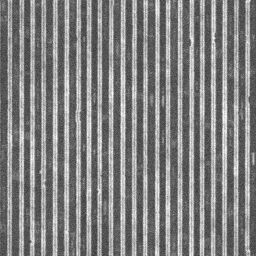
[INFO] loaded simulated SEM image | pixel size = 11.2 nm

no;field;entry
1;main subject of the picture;parallel lines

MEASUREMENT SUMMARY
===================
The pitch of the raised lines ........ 11.3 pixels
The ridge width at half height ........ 3.75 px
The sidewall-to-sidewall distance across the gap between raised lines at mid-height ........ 85.3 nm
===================